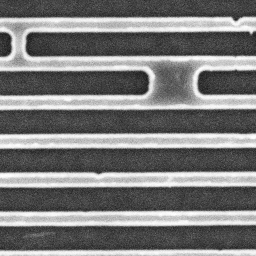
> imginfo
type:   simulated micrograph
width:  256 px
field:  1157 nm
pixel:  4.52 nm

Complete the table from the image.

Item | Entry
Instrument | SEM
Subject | parallel lines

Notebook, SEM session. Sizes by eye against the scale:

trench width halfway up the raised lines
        120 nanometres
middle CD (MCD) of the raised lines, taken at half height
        54.2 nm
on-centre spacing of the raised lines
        0.175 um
